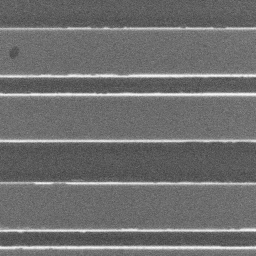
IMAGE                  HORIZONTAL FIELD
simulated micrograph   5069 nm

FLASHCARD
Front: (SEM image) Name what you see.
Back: lines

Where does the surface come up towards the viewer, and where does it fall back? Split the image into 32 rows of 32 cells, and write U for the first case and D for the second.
DDDDDDDDDDDDDDDDDDDDDDDDDDDDDDDD
DDDDDDDDDDDDDDDDDDDDDDDDDDDDDDDD
DDDDDDDDDDDDDDDDDDDDDDDDDDDDDDDD
DDDDDDDDDDDDDDDDDDDDDDDDDDDDDDDD
UUUUUUUUUUUUUUUUUUUUUUUUUUUUUUUU
UUUUUUUUUUUUUUUUUUUUUUUUUUUUUUUU
UUUUUUUUUUUUUUUUUUUUUUUUUUUUUUUU
UUUUUUUUUUUUUUUUUUUUUUUUUUUUUUUU
UUUUUUUUUUUUUUUUUUUUUUUUUUUUUUUU
UUUUUUUUUUUUUUUUUUDUDDDDDDDDDDDD
DDDDDDDDDDDDDDDDDDDDDDDDDDDDDDDD
DDDDDDDDDDDDDDDDDDDDDDDDDDDDDDDD
UUUUUUUUUUUUUUUUUUUUUUUUUUUUUUUU
UUUUUUUUUUUUUUUUUUUUUUUUUUUUUUUU
UUUUUUUUUUUUUUUUUUUUUUUUUUUUUUUU
UUUUUUUUUUUUUUUUUUUUUUUUUUUUUUUU
UUUUUUUUUUUUUUUUUUUUUUUUUUUUUUUU
UUUUUUUUUUUUUUUUUUUUUUUUUUUUUUUU
DDDDDDDDDDDDDDDDDDDDDDDDDDDDDDDD
DDDDDDDDDDDDDDDDDDDDDDDDDDDDDDDD
DDDDDDDDDDDDDDDDDDDDDDDDDDDDDDDD
DDDDDDDDDDDDDDDDDDDDDDDDDDDDDDDD
DDDDDDDDDDDDDDDDDDDDDDDDDDDDDDDD
UUUUUUUUUUUUUUUUUUUUUUUUUUUUUUUU
UUUUUUUUUUUUUUUUUUUUUUUUUUUUUUUU
UUUUUUUUUUUUUUUUUUUUUUUUUUUUUUUU
UUUUUUUUUUUUUUUUUUUUUUUUUUUUUUUU
UUUUUUUUUUUUUUUUUUUUUUUUUUUUUUUU
UUUUUUUUUUUUUUUUUUUUUUUUUUUUUUUU
DDDDDDDDDDDDDDDDDDDDDDDDDDDDDDDD
DDDDDDDDDDDDDDDDDDDDDDDDDDDDDDDD
UUUUUUUUUUUUUUUUUUUUUUUUUUUUUUUU